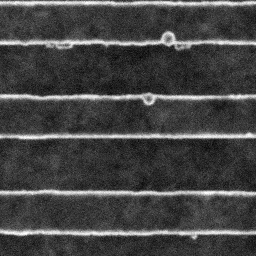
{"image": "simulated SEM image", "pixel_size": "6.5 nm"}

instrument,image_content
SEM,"lines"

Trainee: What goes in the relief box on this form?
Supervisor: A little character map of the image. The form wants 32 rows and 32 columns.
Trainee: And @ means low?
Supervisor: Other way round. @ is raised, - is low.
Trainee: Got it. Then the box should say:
@@@@@@@@@@@@@@@@@@@@@@@@@@@@@@@@
@@@@@@@@@@@@@@@@@@@@@@@@@@@@@@@@
@@@@@@@@@@@@@@@@@@@@@@@@@@@@@@@@
@@@@@@@@@@@@@@@@@@@@@@@@@@@@@@@@
@@@@@@@@@@@@@@@@@@@@@@@@@@@@@@@@
-----------------@---@----------
--------------------------------
--------------------------------
--------------------------------
--------------------------------
--------------------------------
--------------------------------
@@@@@@@@@@@@@@@@@@@@@@@@@@@@@@@@
@@@@@@@@@@@@@@@@@@@@@@@@@@@@@@@@
@@@@@@@@@@@@@@@@@@@@@@@@@@@@@@@@
@@@@@@@@@@@@@@@@@@@@@@@@@@@@@@@@
@@@@@@@@@@@@@@@@@@@@@@@@@@@@@@@@
--------------------------------
--------------------------------
--------------------------------
--------------------------------
--------------------------------
--------------------------------
--------------------------------
@@@@@@@@@@@@@@@@@@@@@@@@@@@@@@@@
@@@@@@@@@@@@@@@@@@@@@@@@@@@@@@@@
@@@@@@@@@@@@@@@@@@@@@@@@@@@@@@@@
@@@@@@@@@@@@@@@@@@@@@@@@@@@@@@@@
@@@@@@@@@@@@@@@@@@@@@@@@@@@@@@@@
--------------------------------
--------------------------------
--------------------------------